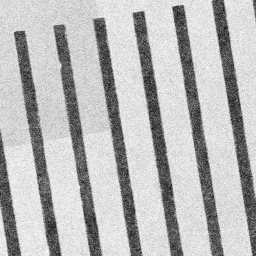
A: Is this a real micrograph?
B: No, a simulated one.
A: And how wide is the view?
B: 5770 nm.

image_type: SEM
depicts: parallel lines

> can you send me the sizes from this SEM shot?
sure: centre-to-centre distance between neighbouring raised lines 0.905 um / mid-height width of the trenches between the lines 281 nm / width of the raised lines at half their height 628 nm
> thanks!